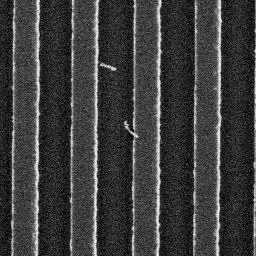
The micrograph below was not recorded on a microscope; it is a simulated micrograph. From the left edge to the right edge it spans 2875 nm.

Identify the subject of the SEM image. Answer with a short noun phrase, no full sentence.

lines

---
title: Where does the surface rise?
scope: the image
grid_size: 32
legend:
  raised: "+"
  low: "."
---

..+++....+++.....+++....++++....
..+++....+++.....+++....++++....
..+++....+++.....+++....++++....
..+++....+++.....+++....++++....
..+++....+++.....+++....++++....
..+++....+++.....+++....++++....
..+++....+++.....+++....++++....
..+++....+++.....+++....++++....
..+++....+++.....+++....++++....
..+++....+++.....+++....++++....
..+++....+++.....+++....++++....
..+++....+++.....+++....++++....
..+++....+++.....+++....++++....
..+++....+++.....+++....+++.....
..+++....+++.....+++....++++....
..+++....+++.....+++....++++....
..+++....+++.....+++....+++.....
..+++....+++.....+++....+++.....
..+++....+++.....+++....+++.....
..+++....+++.....+++....+++.....
..+++....+++.....+++....+++.....
..+++....+++.....+++....+++.....
..+++....+++.....+++....+++.....
..+++....+++.....+++....+++.....
..+++....+++.....+++....+++.....
..+++....+++.....+++....+++.....
..+++....+++.....+++....+++.....
..+++....+++.....+++....+++.....
..+++....+++.....+++....+++.....
..+++....+++.....+++....+++.....
..+++....+++.....+++....+++.....
..+++....+++.....+++....+++.....